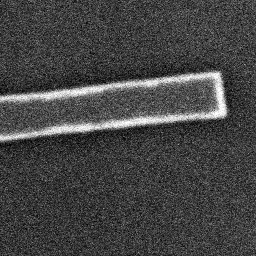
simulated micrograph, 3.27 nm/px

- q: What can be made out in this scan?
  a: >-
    one or a few lines or trenches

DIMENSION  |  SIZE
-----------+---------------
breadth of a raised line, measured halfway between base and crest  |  0.133 micrometres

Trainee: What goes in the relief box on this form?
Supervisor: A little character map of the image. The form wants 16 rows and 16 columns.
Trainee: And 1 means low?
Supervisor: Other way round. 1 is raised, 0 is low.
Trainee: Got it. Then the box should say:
0000000000000000
0000000000000000
0000000000000000
0000000000000000
0000000000000000
0000001111111100
1111111111111100
1111111111100000
1000000000000000
0000000000000000
0000000000000000
0000000000000000
0000000000000000
0000000000000000
0000000000000000
0000000000000000